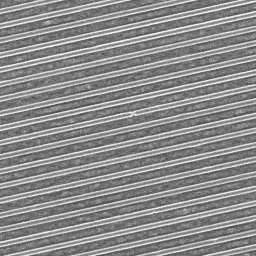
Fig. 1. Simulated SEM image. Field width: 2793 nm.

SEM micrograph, parallel lines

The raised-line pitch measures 155 nm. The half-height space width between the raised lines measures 105 nanometers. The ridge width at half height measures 4.39 pixels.